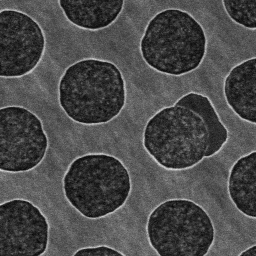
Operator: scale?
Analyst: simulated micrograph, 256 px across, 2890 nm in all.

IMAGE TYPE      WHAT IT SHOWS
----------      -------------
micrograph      holes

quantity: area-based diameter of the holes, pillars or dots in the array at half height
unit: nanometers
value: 733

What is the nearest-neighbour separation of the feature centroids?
1040 nm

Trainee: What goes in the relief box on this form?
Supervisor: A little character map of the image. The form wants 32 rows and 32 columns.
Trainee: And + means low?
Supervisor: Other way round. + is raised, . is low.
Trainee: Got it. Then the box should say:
++++++++.......+++++++++++++....
..++++++.......+++++...+++++....
....+++++.....+++++.....+++++...
.....++++++.++++++.......+++++++
.....+++++++++++++........++++++
.....+++++++++++++........++++++
.....+++++++++++++........++++++
.....++++++.++++++.......++++++.
....+++++......++++.....+++++...
..++++++.......++++++++++++++...
++++++++.......+++++++++++++....
+++++++.........++++++++++++....
+++++++.........++++++....++....
+..+++++.......++++++......++...
....+++++.....+++++........+++..
.....+++++++++++++..........++++
.....+++++++++++++..........++++
......++++++++++++..........++++
......++++++++++++.........+++++
.....++++++...+++++.......+++++.
.....++++......+++++....+++++...
++++++++........+++++++++++++...
++++++++........+++++++++++++...
++++++++........+++++++++++++...
++++++++........+++++++++++++...
....+++++......+++++....+++++...
.....+++++....+++++.......++++..
......+++++++++++++.......++++++
......++++++++++++.........+++++
......+++++++++++++........+++++
......+++++++++++++.......++++++
.....+++++.....+++++......++++..